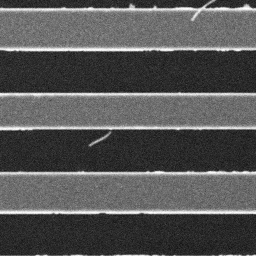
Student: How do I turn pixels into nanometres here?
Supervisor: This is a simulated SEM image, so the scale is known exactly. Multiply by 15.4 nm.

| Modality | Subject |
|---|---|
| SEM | lines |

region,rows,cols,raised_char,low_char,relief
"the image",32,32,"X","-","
--------------------------------
XXXXXXXXXXXXXXXXXXXXXXXXXXXXXXXX
XXXXXXXXXXXXXXXXXXXXXXXXXXXXXXXX
XXXXXXXXXXXXXXXXXXXXXXXXXXXXXXXX
XXXXXXXXXXXXXXXXXXXXXXXXXXXXXXXX
XXXXXXXXXXXXXXXXXXXXXXXXXXXXXXXX
--------------------------------
--------------------------------
--------------------------------
--------------------------------
--------------------------------
--------------------------------
XXXXXXXXXXXXXXXXXXXXXXXXXXXXXXXX
XXXXXXXXXXXXXXXXXXXXXXXXXXXXXXXX
XXXXXXXXXXXXXXXXXXXXXXXXXXXXXXXX
XXXXXXXXXXXXXXXXXXXXXXXXXXXXXXXX
--------------------------------
--------------------------------
--------------------------------
--------------------------------
--------------------------------
-------------------XX-----X-----
XXXXXXXXXXXXXXXXXXXXXXXXXXXXXXXX
XXXXXXXXXXXXXXXXXXXXXXXXXXXXXXXX
XXXXXXXXXXXXXXXXXXXXXXXXXXXXXXXX
XXXXXXXXXXXXXXXXXXXXXXXXXXXXXXXX
XXXXXXXXXXXXXXXXXXXXXXXXXXXXXXXX
--------------------------------
--------------------------------
--------------------------------
--------------------------------
--------------------------------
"